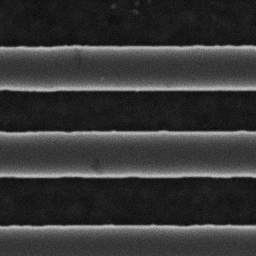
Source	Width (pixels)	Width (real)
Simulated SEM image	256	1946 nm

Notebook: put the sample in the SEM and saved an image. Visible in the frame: lines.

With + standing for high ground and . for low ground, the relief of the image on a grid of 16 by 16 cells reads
................
................
................
++++++++++++++++
++++++++++++++++
++++++++++++++++
................
................
++++++++++++++++
++++++++++++++++
++++++++++++++++
................
................
................
++++++++++++++++
++++++++++++++++